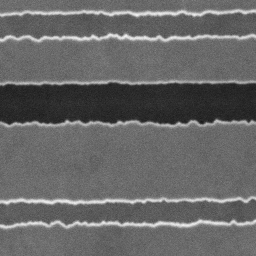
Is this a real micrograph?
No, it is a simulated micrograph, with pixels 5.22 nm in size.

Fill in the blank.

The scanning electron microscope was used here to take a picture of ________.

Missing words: lines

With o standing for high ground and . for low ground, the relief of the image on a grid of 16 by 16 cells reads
oooooooooooooooo
oooooooooooooooo
oooooooooooooooo
oooooooooooooooo
oooooooooooooooo
................
................
................
oooooooooooooooo
oooooooooooooooo
oooooooooooooooo
oooooooooooooooo
oooooooooooooooo
oooooooooooooooo
oooooooooooooooo
oooooooooooooooo